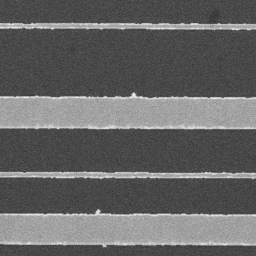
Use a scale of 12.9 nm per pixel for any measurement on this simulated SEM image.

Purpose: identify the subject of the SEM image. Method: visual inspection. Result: lines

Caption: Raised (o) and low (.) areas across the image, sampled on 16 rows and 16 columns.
................
................
................
................
................
................
oooooooooooooooo
oooooooooooooooo
................
................
................
................
................
oooooooooooooooo
oooooooooooooooo
................